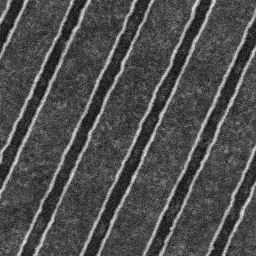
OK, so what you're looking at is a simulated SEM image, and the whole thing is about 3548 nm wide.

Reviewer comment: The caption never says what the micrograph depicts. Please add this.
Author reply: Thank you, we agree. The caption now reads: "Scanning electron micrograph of parallel lines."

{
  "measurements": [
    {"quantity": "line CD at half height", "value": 601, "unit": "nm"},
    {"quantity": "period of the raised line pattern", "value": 790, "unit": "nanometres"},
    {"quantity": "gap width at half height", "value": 192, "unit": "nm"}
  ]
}